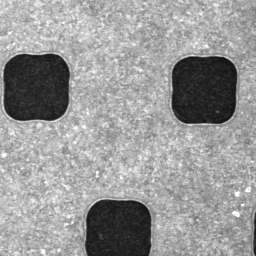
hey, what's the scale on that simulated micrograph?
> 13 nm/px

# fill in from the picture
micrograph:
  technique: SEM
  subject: holes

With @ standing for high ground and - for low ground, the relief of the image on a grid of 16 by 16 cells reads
@@@@@@@@@@@@@@@@
@@@@@@@@@@@@@@@@
@@@@@@@@@@@@@@@@
@---@@@@@@@@@@@@
----@@@@@@@----@
----@@@@@@@----@
----@@@@@@@----@
@--@@@@@@@@---@@
@@@@@@@@@@@@@@@@
@@@@@@@@@@@@@@@@
@@@@@@@@@@@@@@@@
@@@@@@@@@@@@@@@@
@@@@@@@-@@@@@@@@
@@@@@----@@@@@@@
@@@@@----@@@@@@@
@@@@@----@@@@@@@